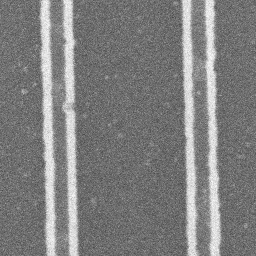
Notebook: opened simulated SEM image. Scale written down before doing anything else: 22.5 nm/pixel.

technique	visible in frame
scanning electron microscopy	one or a few lines or trenches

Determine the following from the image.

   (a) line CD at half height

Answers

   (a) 500 nm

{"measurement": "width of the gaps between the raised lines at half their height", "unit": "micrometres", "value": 2.68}